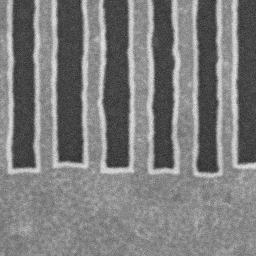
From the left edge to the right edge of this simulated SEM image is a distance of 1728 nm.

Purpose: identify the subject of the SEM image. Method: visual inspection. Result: parallel lines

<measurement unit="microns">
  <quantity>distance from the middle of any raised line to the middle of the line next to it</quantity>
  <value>0.306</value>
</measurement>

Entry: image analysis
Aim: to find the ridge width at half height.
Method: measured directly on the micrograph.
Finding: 115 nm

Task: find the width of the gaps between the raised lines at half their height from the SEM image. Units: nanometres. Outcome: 182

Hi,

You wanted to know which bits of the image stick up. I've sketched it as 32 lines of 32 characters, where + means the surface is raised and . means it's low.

+....++....++...+++...++...++...
+....++....++...+++...++...++...
+....++....++...+++...++...++...
+....++....++...+++...++....+...
+....++....++...+++...++...++...
+....++....++...+++...++...++...
+....++....++...+++...++....+...
+....++....++...+++...++....+...
+....++....++....++...++...++...
+....++....++....++...++...++...
+....++....++....++...++....+...
+....++....++....++...++....+...
+....++....++....++...++....+...
+....++....++....++...++....+...
+....++....++....++...++....+...
+....++....++....++...++...++...
+....++....++....++...++...++...
+....++....++....++...++...++...
+....++....++....++...++...++...
+....++....++...+++...++....+...
+....++....++...+++...++....+...
+++++++++++++++++++.++++....++++
++++++++++++++++++++++++++++++++
++++++++++++++++++++++++++++++++
++++++++++++++++++++++++++++++++
++++++++++++++++++++++++++++++++
++++++++++++++++++++++++++++++++
++++++++++++++++++++++++++++++++
++++++++++++++++++++++++++++++++
++++++++++++++++++++++++++++++++
++++++++++++++++++++++++++++++++
++++++++++++++++++++++++++++++++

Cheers